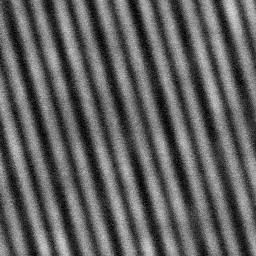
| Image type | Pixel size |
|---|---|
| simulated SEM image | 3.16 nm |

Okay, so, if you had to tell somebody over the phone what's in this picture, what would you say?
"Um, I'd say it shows parallel lines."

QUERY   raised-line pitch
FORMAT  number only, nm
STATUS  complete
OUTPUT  64.6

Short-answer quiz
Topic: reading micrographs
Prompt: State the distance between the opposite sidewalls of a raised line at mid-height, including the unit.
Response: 32.3 nm